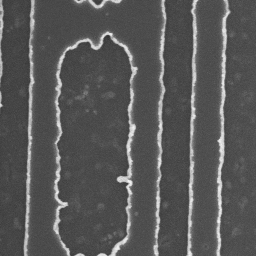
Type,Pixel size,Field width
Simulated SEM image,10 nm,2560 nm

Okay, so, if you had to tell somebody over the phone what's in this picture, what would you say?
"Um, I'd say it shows one or a few lines or trenches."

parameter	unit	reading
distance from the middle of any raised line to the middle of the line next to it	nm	807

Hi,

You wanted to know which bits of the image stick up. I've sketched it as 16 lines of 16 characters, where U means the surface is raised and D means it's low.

DDUUUUUUUUDDUUDD
DDUUUUUUUUDDUUDD
DDUUUUUUUUDDUUDD
DDUUDDDDUUDDUUDD
DDUUDDDDUUDDUUDD
DDUUDDDDUUDDUUDD
DDUUDDDDUUDDUUDD
DDUUDDDDUUDDUUDD
DDUUDDDDUUDDUUDD
DDUUDDDDUUDDUUDD
DDUUDDDDUUDDUUDD
DDUUDDDDUUDDUUDD
DDUUDDDDUUDDUUDD
DDUUDDDDUUDDUUDD
DDUUDDDDUUDDUUDD
DDUUDDDUUUDDUUDD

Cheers